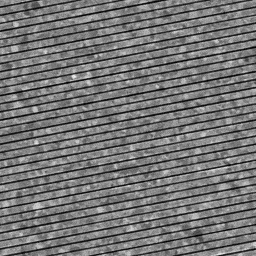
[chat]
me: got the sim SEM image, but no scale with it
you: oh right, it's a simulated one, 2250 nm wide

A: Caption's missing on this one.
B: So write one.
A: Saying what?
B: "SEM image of parallel lines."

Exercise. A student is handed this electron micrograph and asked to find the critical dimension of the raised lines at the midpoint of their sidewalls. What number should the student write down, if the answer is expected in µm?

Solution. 0.0486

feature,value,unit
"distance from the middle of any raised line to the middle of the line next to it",0.0696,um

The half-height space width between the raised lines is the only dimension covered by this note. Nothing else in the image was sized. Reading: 16.2 nanometers